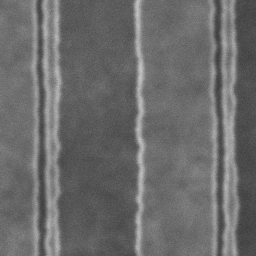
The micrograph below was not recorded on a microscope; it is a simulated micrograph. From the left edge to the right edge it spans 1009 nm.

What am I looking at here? lines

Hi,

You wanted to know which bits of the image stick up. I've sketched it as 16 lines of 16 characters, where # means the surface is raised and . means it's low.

####.....######.
####.....######.
####.....######.
####.....######.
####.....######.
####.....######.
####.....######.
####.....######.
####.....######.
####.....######.
####.....######.
####.....######.
####.....######.
####.....######.
####.....######.
####.....######.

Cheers